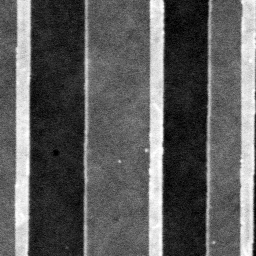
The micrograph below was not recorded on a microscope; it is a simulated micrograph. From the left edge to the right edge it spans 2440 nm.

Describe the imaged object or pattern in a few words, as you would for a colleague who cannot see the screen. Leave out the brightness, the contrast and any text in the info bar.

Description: lines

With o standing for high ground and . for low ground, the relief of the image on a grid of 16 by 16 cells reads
oo...ooooo...ooo
oo...ooooo...ooo
oo...ooooo...ooo
oo...ooooo...ooo
oo...ooooo...ooo
oo...ooooo...ooo
oo...ooooo...ooo
oo...ooooo...ooo
oo...ooooo...ooo
oo...ooooo...ooo
oo...ooooo...ooo
oo...ooooo...ooo
oo...ooooo...ooo
oo...ooooo...ooo
oo...ooooo...ooo
oo...ooooo...ooo